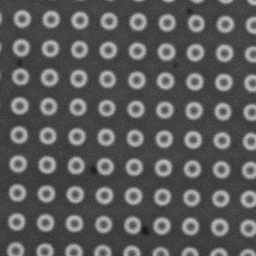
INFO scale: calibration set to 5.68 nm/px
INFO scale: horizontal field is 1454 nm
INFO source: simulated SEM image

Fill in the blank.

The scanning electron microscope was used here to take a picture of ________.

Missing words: an array of small figures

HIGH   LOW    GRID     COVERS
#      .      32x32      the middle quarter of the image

................................
................................
..###....###.....##.....##......
..####...####...####....###....#
..###....####...####...####....#
...##.....##.....###....###....#
................................
................................
................................
..###.....##.....##.............
..###....####...####....###....#
..###....####...####...####....#
..##.....###....####...####....#
................................
................................
................................
..##......#.....................
.####....###....###.....###....#
.####....###....####...####...##
..###....###....###....####...##
........................##.....#
................................
................................
..##............................
.####....###....###.....##.....#
.####...####....####...####...##
.####....###....###....####...##
..........#.....###....###....##
................................
................................
................................
.###.....###....###.....##......